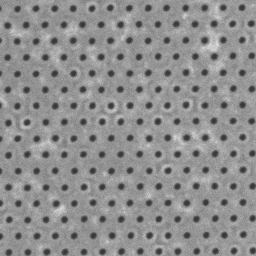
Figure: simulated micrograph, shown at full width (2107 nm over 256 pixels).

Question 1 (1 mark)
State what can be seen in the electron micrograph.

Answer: a regular array of holes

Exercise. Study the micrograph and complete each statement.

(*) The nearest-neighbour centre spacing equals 150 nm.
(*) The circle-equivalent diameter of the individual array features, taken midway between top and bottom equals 0.0572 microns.